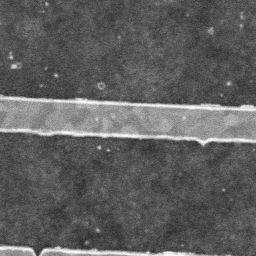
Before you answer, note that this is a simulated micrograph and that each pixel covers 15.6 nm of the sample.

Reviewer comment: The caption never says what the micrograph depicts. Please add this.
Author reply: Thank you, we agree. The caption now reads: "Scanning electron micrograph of one or a few lines or trenches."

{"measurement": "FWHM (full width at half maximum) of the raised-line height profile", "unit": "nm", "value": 488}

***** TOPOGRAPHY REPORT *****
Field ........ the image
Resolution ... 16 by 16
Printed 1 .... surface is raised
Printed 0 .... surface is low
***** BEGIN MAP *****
0000000000000000
0000000000000000
0000000000000000
0000000000000000
0000000000000000
0000000000000000
1111111000000000
1111111111111111
0000000011111111
0000000000000000
0000000000000000
0000000000000000
0000000000000000
0000000000000000
0000000000000000
1000000000000000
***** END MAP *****